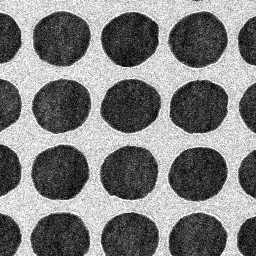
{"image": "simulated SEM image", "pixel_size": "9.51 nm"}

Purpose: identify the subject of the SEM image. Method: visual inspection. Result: a regular array of holes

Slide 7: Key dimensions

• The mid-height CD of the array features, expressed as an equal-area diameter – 534 nanometres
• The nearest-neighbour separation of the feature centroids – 0.637 µm